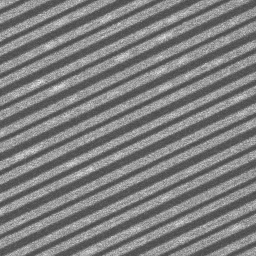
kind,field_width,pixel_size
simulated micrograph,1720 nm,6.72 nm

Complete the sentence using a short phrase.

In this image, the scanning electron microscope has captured parallel lines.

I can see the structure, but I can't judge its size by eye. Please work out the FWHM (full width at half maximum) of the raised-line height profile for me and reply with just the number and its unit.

0.0523 um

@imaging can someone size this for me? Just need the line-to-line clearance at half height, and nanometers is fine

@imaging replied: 40.9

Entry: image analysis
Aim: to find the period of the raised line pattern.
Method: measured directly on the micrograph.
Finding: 97.4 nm